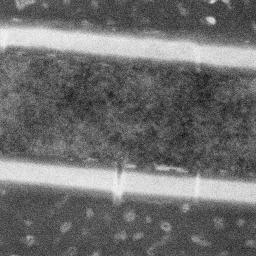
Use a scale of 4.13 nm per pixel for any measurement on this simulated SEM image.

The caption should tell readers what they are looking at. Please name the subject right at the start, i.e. one or a few lines or trenches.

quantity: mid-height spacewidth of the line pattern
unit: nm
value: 562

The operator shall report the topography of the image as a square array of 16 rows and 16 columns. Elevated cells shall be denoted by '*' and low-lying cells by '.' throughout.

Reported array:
****************
****************
....************
..............**
................
................
................
................
................
................
................
*******.........
****************
****************
****************
****************